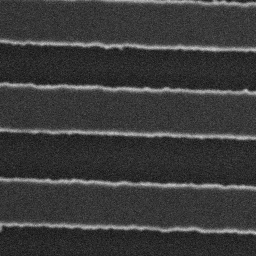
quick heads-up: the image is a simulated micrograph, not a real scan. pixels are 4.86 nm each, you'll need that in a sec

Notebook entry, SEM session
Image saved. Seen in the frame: lines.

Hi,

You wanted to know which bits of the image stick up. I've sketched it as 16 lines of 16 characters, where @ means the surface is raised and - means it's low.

@@@@@@@@@@@@@@@@
@@@@@@@@@@@@@@@@
@@@@@@@@@@@@@@@@
----------------
----------------
@@@@@@@@--------
@@@@@@@@@@@@@@@@
@@@@@@@@@@@@@@@@
---------@@@@@@@
----------------
----------------
@@@@@@@@@@@-----
@@@@@@@@@@@@@@@@
@@@@@@@@@@@@@@@@
-------------@@@
----------------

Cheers